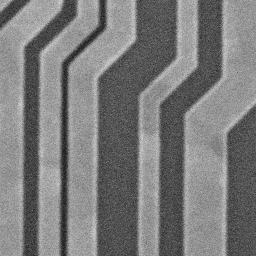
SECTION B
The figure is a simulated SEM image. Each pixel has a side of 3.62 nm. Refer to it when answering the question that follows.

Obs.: groups of lines, slits or small figures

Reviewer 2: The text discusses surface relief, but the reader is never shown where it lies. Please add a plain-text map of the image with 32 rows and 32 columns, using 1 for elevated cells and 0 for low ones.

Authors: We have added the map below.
10001111001101111000001110001111
00111110001101111000001110001111
00111100011101111000001110001111
11111000111101111000001110001111
11110001111001111000001110001111
11100011110111110000001110001111
11100111101111100000001110001111
11100111011111000000001110001111
11100110011110000000011100001111
11100110011100000000111000001111
11100110011100000001110000011111
11100111011100000011100000111111
11100111011100000011000001111111
11100110011100000011000011111110
11100110011100000011000111111100
11100110011100000011000111111000
11100110011100000011000111110000
11100110011100000011000111110000
11100110011100000011000111110000
11100110011100000011000111110000
11100110011100000011000111110000
11100110011100000011000111110000
11100110011100000011000111110000
11100110011100000011000111110000
11100110011100000011000111110000
11100110011100000011000111110000
11100110011100000011000111110000
11100110011100000011000111110000
11100110011100000011000111110000
11100110011100000011000111110000
11100110011100000011000111110000
11100110011100000011000111110000